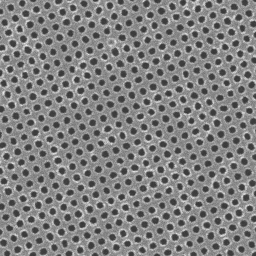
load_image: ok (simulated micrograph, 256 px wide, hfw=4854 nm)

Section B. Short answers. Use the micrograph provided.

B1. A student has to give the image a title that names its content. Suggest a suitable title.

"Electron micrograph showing a regular array of holes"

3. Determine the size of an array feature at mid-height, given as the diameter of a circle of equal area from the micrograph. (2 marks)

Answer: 0.139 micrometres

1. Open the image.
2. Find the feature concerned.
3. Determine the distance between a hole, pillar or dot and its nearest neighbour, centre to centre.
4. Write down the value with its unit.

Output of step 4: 211 nanometres